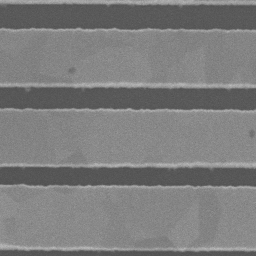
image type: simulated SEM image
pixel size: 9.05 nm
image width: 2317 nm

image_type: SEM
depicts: lines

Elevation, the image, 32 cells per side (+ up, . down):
................................
................................
................................
................................
++++++++++++++++++++++++++++++++
++++++++++++++++++++++++++++++++
++++++++++++++++++++++++++++++++
++++++++++++++++++++++++++++++++
++++++++++++++++++++++++++++++++
++++++++++++++++++++++++++++++++
++++++++++++++++++++++++++++++++
................................
................................
................................
++++++++++++++++++++++++++++++++
++++++++++++++++++++++++++++++++
++++++++++++++++++++++++++++++++
++++++++++++++++++++++++++++++++
++++++++++++++++++++++++++++++++
++++++++++++++++++++++++++++++++
++++++++++++++++++++++++++++++++
................................
................................
++++++++++++++++++++++++++++++++
++++++++++++++++++++++++++++++++
++++++++++++++++++++++++++++++++
++++++++++++++++++++++++++++++++
++++++++++++++++++++++++++++++++
++++++++++++++++++++++++++++++++
++++++++++++++++++++++++++++++++
++++++++++++++++++++++++++++++++
................................